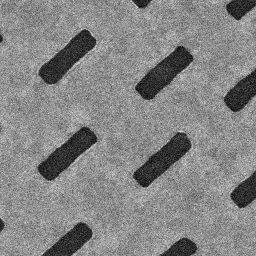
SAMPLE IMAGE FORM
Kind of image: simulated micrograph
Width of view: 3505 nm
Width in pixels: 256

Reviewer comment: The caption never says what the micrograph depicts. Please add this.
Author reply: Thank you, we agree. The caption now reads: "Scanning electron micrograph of holes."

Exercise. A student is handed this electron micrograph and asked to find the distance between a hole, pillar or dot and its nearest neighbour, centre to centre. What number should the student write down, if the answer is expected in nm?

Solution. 1250